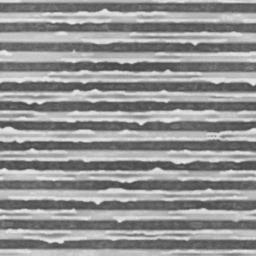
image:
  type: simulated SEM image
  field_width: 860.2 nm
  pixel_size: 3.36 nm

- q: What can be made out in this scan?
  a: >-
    parallel lines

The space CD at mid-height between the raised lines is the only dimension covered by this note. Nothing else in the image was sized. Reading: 33.2 nm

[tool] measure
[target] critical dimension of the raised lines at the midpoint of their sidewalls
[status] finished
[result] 0.0332 microns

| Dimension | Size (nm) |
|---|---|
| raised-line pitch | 66.5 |